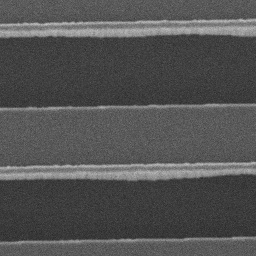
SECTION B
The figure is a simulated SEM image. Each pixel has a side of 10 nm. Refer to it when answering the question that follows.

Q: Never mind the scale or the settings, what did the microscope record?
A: lines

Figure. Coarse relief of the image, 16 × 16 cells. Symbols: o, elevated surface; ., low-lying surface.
oooooooooooooooo
oooooooooooooooo
................
................
................
................
................
oooooooooooooooo
oooooooooooooooo
oooooooooooooooo
oooooooooooooooo
................
................
................
................
oooooooooooooooo